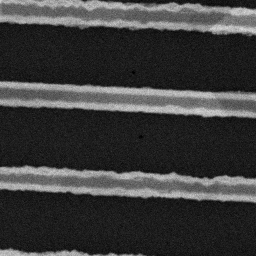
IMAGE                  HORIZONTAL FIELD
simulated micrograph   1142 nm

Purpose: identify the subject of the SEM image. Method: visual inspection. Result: one or a few lines or trenches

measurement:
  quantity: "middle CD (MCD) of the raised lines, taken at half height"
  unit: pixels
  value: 18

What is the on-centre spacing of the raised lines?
376 nanometers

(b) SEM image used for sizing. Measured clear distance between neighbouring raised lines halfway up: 295 nm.